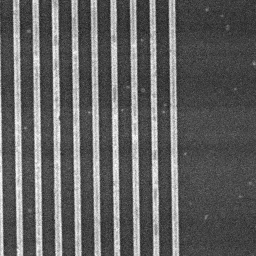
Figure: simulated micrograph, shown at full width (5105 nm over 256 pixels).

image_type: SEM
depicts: parallel lines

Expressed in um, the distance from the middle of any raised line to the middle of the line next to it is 0.389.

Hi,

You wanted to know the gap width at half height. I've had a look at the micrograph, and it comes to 289 nm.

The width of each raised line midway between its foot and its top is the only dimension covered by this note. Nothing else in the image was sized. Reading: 107 nm